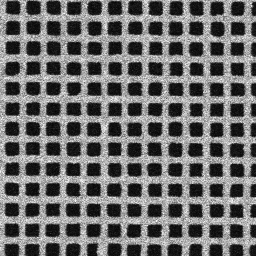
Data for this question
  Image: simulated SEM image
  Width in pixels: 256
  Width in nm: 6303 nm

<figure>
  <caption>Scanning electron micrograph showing a regular array of holes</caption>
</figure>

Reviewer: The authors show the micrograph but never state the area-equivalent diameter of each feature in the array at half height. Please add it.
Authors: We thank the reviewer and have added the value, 383 nanometres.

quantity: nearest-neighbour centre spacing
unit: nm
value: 492